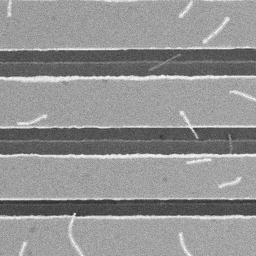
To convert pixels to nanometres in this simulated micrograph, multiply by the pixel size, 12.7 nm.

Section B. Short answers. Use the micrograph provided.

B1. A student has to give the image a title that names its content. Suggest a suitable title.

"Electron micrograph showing lines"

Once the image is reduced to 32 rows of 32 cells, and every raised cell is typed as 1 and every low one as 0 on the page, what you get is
11111111111111111111111111111111
11111111111111111111111111111111
11111111111111111111111111111111
11111111111111111111111111111111
11111111111111111111111111111111
11111111111111111111111111111111
00000000000000000000000000000000
00000000000000000000000000000000
00000000000000000000000000000000
00000000000000000000000000000000
11111111111111111111111111111111
11111111111111111111111111111111
11111111111111111111111111111111
11111111111111111111111111111111
11111111111111111111111111111111
11111111111111111111111111111111
00000000000000000000000000000000
00000000000000000000000000000000
00000000000000000000000000000000
11111111111111111111111111111111
11111111111111111111111111111111
11111111111111111111111111111111
11111111111111111111111111111111
11111111111111111111111111111111
11111111111111111111111111111111
00000000000000000000000000000000
00000000000000000000000000000000
11111111111111111111111111111111
11111111111111111111111111111111
11111111111111111111111111111111
11111111111111111111111111111111
11111111111111111111111111111111